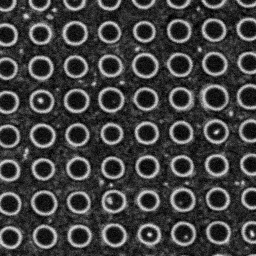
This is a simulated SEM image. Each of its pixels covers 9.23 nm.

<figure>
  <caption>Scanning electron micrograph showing a regular array of raised bodies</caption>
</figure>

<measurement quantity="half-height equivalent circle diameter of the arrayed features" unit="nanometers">202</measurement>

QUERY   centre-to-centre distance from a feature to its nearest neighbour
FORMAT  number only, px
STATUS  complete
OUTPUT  33.7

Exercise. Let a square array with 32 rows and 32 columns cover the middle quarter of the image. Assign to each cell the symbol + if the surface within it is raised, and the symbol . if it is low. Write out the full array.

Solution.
++++++...+++++...++++++...++++++
++++++...+++++....+++++....+++++
.++++.....+++.....+++++....++++.
................................
................................
................................
..++......+++......+++......+++.
.++++....+++++....+++++....++++.
++++++...++++++...+++++....+++++
++++++...++++++...+++++....++++.
++++++...+++++....+++++.....+++.
..+++.....+++...................
................................
................................
.............................+..
..+++.....+++......++++....++++.
.+++++....++++....+++++....+++++
.+++++...+++++....+++++....+++++
.+++++....++++....+++++....+++++
.++++......++......+++.......+..
................................
................................
................................
...........++.......+++.....+++.
..++++....++++....+++++....+++++
.+++++....+++++...+++++....+++++
.+++++....+++++...+++++....+++++
.+++++....+++++....++++.....+++.
..+++...........................
................................
................................
............................+++.